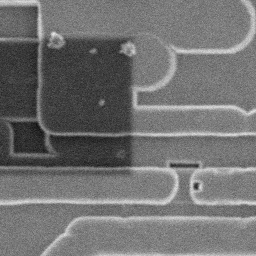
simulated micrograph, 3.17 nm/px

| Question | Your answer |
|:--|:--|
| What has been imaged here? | wiring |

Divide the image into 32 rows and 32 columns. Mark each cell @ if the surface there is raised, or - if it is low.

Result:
-----@@@@@@@@@@@@@@@@@@@@@@@@@@-
-----@@@@@@@@@@@@@@@@@@@@@@@@@@@
-----@@@@@@@@@@@@@@@@@@@@@@@@@@@
-----@@@@@@@@@@@@@@@@@@@@@@@@@@@
-----@@@@@@@@@@@@@@@@@@@@@@@@@@-
-----@@@@@@@@@@@@@@@@@@@@@@@@@@-
-----@@@@@@@@@@@@@@@@@----------
-----@@@@@@@@@@@@@@@@@----------
-----@@@@@@@@@@@@@@@@@----------
-----@@@@@@@@@@@@@@@@-----------
-----@@@@@@@@@@@@@@@------------
-----@@@@@@@@@@@@---------------
-----@@@@@@@@@@@@---------------
-----@@@@@@@@@@@@@@@@@@@@@@@@@--
-----@@@@@@@@@@@@@@@@@@@@@@@@@@@
-----@@@@@@@@@@@@@@@@@@@@@@@@@@@
------@@@@@@@@@@@@@@@@@@@@@@@@@@
--------------------------------
--------------------------------
--------------------------------
--------------------------------
@@@@@@@@@@@@@@@@@@@@@@---@@@@@@@
@@@@@@@@@@@@@@@@@@@@@@--@@@@@@@@
@@@@@@@@@@@@@@@@@@@@@@---@@@@@@@
@@@@@@@@@@@@@@@@@@@@@@--@@@@@@@@
--------------------------------
--------------------------------
----------@@@@@-@@@@@@@@@@@@@@@@
---------@@@@@@@@@@@@@@@@@@@@@@@
--------@@@@@@@@@@@@@@@@@@@@@@@@
-------@@@@@@@@@@@@@@@@@@@@@@@@@
------@@@@@@@@@@@@@@@@@@@@@@@@@@